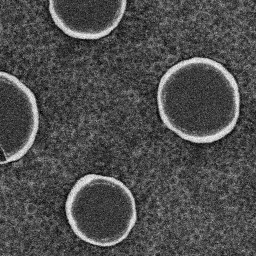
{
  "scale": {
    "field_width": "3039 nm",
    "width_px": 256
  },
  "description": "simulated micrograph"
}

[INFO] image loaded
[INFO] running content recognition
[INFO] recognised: raised bodies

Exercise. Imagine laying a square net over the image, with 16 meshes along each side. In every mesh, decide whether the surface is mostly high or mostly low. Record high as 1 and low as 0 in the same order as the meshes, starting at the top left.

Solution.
0001111100000000
0000111000000000
0000000000000000
0000000000000000
0000000000011100
1000000000111110
1100000000111110
1100000000111110
1100000000011100
1000000000000000
0000000000000000
0000011100000000
0000111100000000
0000111100000000
0000011100000000
0000000000000000